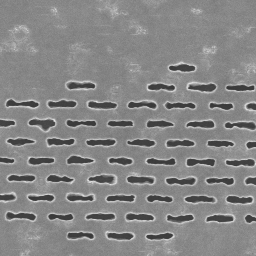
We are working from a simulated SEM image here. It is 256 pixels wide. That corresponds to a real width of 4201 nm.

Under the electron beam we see a regular array of holes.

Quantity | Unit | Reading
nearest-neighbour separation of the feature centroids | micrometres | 0.428